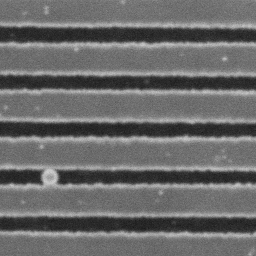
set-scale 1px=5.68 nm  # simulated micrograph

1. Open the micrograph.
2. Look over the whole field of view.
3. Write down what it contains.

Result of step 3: lines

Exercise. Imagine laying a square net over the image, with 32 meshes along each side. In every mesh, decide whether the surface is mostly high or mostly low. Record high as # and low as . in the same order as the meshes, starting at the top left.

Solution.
################################
################################
################################
................................
................................
##.###..####..####..############
################################
################################
################################
................................
................................
################################
################################
################################
################################
................................
................................
################################
################################
################################
################################
.....##.........................
.....##.........................
################################
################################
################################
################################
................................
................................
################################
################################
################################